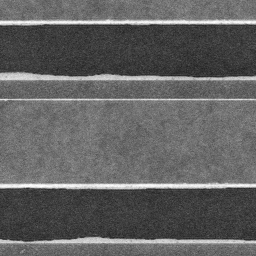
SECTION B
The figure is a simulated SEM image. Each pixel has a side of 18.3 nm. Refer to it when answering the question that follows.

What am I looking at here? lines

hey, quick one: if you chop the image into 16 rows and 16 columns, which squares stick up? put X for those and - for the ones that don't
XXXXXXXXXXXXXXXX
----------------
----------------
----------------
----------------
XXXXXXXXXXXXXXXX
XXXXXXXXXXXXXXXX
XXXXXXXXXXXXXXXX
XXXXXXXXXXXXXXXX
XXXXXXXXXXXXXXXX
XXXXXXXXXXXXXXXX
XXXXXXXXXXXXXXXX
----------------
----------------
----------------
XXXXXXXXXXXXXXXX